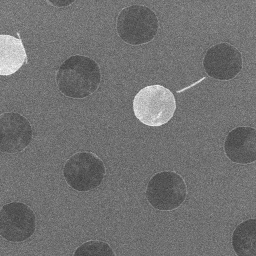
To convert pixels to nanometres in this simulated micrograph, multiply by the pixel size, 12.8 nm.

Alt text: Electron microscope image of raised bodies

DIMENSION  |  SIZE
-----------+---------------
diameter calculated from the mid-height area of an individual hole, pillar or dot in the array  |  521 nm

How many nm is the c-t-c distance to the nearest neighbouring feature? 1040